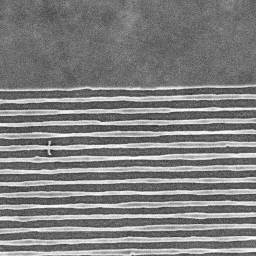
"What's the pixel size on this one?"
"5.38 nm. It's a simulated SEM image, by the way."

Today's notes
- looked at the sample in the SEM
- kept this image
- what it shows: parallel lines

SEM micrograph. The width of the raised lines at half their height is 20.8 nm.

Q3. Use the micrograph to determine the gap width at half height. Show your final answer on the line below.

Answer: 41.7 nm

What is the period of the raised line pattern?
63.4 nm